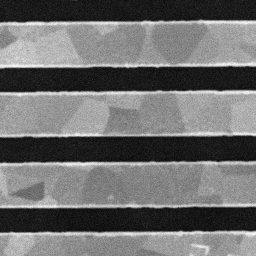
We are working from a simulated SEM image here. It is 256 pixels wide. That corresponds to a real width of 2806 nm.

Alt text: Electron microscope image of lines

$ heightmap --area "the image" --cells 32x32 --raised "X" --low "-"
--------------------------------
--------------------------------
--------------------------------
XXXXXXXXXXXXXXXXXXXXXXXXXXXXXXXX
XXXXXXXXXXXXXXXXXXXXXXXXXXXXXXXX
XXXXXXXXXXXXXXXXXXXXXXXXXXXXXXXX
XXXXXXXXXXXXXXXXXXXXXXXXXXXXXXXX
XXXXXXXXXXXXXXXXXXXXXXXXXXXXXXXX
--------------------------------
--------------------------------
--------------------------------
-------XXXXXXXXXXXXXXXXXXXXXXXXX
XXXXXXXXXXXXXXXXXXXXXXXXXXXXXXXX
XXXXXXXXXXXXXXXXXXXXXXXXXXXXXXXX
XXXXXXXXXXXXXXXXXXXXXXXXXXXXXXXX
XXXXXXXXXXXXXXXXXXXXXXXXXXXXXXXX
XXXXXXXXXXXXXXXXXXXXXXXXXXXXXXXX
--------------------------------
--------------------------------
--------------------------------
XXXXXXXXXXXXXXXXXXXXXXXXXXXXXXXX
XXXXXXXXXXXXXXXXXXXXXXXXXXXXXXXX
XXXXXXXXXXXXXXXXXXXXXXXXXXXXXXXX
XXXXXXXXXXXXXXXXXXXXXXXXXXXXXXXX
XXXXXXXXXXXXXXXXXXXXXXXXXXXXXXXX
XXXXXXXXXXXXXXXXXXXXXXXXXXXXXXXX
--------------------------------
--------------------------------
--------------------------------
XXXXXXXXXXXXXXXXXXXXXXXXXXXXXXXX
XXXXXXXXXXXXXXXXXXXXXXXXXXXXXXXX
XXXXXXXXXXXXXXXXXXXXXXXXXXXXXXXX